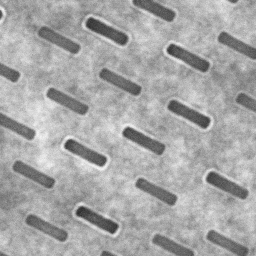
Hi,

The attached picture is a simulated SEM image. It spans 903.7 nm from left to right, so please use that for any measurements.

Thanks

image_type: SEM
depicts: a regular array of holes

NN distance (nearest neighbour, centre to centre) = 185 nanometers